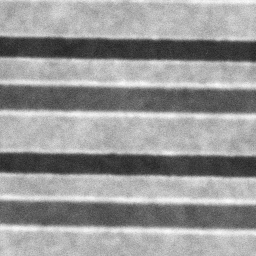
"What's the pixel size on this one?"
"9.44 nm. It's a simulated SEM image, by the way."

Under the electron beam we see lines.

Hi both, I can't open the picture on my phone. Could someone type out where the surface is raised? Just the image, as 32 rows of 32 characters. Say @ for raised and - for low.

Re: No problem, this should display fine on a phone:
@@@@@@@@@@@@@@@@@@@@@@@@@@@@@@@@
@@@@@@@@@@@@@@@@@@@@@@@@@@@@@@@@
@@@@@@@@@@@@@@@@@@@@@@@@@@@@@@@@
@@@@@@@@@@@@@@@@@@@@@@@@@@@@@@@@
--------@@@@@@@@@@@@@@@@@@@@@@@@
--------------------------------
--------------------------------
@@@@@@@@@@----------------------
@@@@@@@@@@@@@@@@@@@@@@@@@@@@@@@@
@@@@@@@@@@@@@@@@@@@@@@@@@@@@@@@@
---------------@@@@@@@@@@@@@@@@@
--------------------------------
--------------------------------
--------------------------------
@@@@@@@@@@@@@@@@@@@@-@----------
@@@@@@@@@@@@@@@@@@@@@@@@@@@@@@@@
@@@@@@@@@@@@@@@@@@@@@@@@@@@@@@@@
@@@@@@@@@@@@@@@@@@@@@@@@@@@@@@@@
@@@@@@@@@@@@@@@@@@@@@@@@@@@@@@@@
--------------------------------
--------------------------------
--------------------------------
@@@@@@@@@@@@@@@@@@@@@@@@@@@@@@@@
@@@@@@@@@@@@@@@@@@@@@@@@@@@@@@@@
@@@@@@@@@@@@@@@@@@@@@@@@@@@@@@@@
--------------------------------
--------------------------------
--------------------------------
--------------------------------
@@@@@@@@@@@@@@@@@@@@@@@@@@@@@@@@
@@@@@@@@@@@@@@@@@@@@@@@@@@@@@@@@
@@@@@@@@@@@@@@@@@@@@@@@@@@@@@@@@